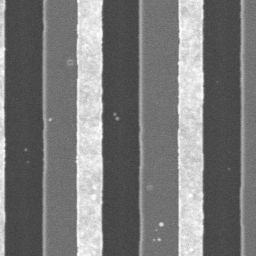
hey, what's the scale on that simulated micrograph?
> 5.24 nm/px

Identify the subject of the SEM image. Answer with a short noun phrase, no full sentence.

lines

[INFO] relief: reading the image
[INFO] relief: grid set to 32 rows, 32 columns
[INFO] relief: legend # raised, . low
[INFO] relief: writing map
#....########.....#######.....##
#....########.....#######.....##
.....########.....#######.....##
.....########.....#######.....##
.....########.....#######.....##
#....########.....#######.....##
#....########.....#######.....##
.....########.....#######.....##
.....########.....#######.....##
.....########.....#######.....##
.....########.....#######.....##
.....########.....#######.....##
.....########.....#######.....##
.....########.....#######.....##
.....########.....#######.....##
......#######.....#######.....##
.....########.....#######.....##
#....########.....#######.....##
#....########.....#######.....##
#....########.....#######.....##
#....########.....#######.....##
.....########.....#######.....##
.....########.....#######.....##
.....########.....#######.....##
.....########.....#######.....##
.....########.....#######.....##
#....########.....#######.....##
#....########.....#######.....##
.....########.....#######.....##
.....########.....#######.....##
.....########.....#######.....##
.....########.....#######.....##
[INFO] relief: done